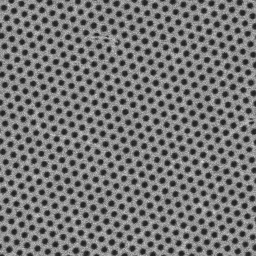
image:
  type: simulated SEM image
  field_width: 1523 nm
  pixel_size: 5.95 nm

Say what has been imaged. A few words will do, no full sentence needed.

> a regular array of holes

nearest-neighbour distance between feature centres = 0.0619 µm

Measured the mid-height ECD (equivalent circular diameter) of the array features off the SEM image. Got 34.3 nanometers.